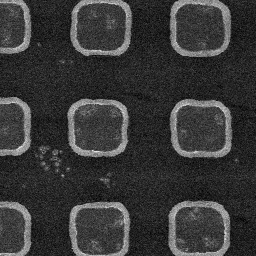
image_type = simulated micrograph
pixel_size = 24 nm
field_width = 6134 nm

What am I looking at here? raised bodies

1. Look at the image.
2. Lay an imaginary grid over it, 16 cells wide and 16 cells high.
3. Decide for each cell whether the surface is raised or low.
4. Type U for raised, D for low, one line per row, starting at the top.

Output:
UUDDDUUUDDDUUUDD
UUDDDUUUDDDUUUDD
UUDDDUUUDDDUUUDD
DDDDDDDDDDDDDDDD
DDDDDDDDDDDDDDDD
DDDDDDDDDDDDDDDD
UDDDDUUDDDDUUUDD
UUDDUUUUDDDUUUDD
UUDDUUUUDDDUUUDD
UDDDDUUDDDDUUUDD
DDDDDDDDDDDDDDDD
DDDDDDDDDDDDDDDD
DDDDDDDDDDDDDDDD
UUDDDUUUDDDUUUDD
UUDDDUUUDDDUUUDD
UUDDDUUUDDDUUUDD